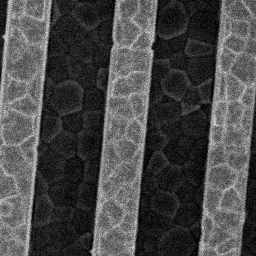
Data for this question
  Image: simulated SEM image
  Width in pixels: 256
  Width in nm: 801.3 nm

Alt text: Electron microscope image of one or a few lines or trenches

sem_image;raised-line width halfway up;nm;125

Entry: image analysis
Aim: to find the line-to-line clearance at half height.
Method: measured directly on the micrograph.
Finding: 207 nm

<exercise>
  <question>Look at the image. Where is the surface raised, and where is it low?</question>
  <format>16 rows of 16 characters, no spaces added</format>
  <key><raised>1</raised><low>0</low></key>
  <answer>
0110000111000011
0110000111000011
1110000111000011
1110000110000011
1110000110000011
1110000110000111
1110000110000111
1100000110000111
1100001110000111
1100001110000111
1100001110000111
1100001110000110
1100001110000110
1100001110000110
1100001100000110
1100001100001110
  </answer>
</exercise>